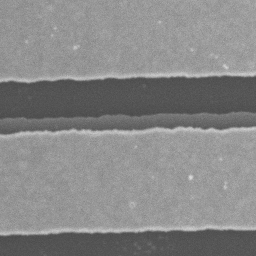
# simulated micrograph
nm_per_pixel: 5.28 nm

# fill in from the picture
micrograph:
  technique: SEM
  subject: lines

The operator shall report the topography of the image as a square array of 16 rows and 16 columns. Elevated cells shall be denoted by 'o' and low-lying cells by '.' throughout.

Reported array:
oooooooooooooooo
oooooooooooooooo
oooooooooooooooo
oooooooooooooooo
oooooooooooooooo
................
................
................
oooooooooooooooo
oooooooooooooooo
oooooooooooooooo
oooooooooooooooo
oooooooooooooooo
oooooooooooooooo
oooooooo........
................